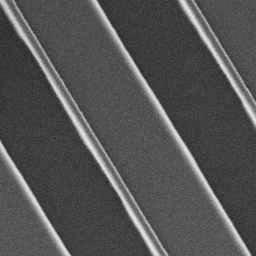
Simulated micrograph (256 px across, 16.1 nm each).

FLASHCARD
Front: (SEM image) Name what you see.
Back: lines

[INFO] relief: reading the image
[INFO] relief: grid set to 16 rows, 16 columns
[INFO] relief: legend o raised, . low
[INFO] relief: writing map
oooooo......oooo
.oooooo.....oooo
..ooooo......ooo
..oooooo......oo
...oooooo.....oo
....ooooo......o
....oooooo.....o
.....ooooo......
.....oooooo.....
......oooooo....
o......ooooo....
oo.....oooooo...
oo......oooooo..
ooo.....oooooo..
ooo......oooooo.
oooo......ooooo.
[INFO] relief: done